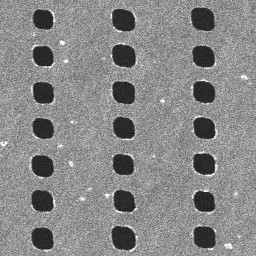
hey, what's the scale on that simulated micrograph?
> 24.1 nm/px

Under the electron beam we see a regular array of holes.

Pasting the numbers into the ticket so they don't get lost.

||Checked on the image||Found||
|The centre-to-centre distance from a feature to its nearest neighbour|0.861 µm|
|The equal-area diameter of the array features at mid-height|555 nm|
